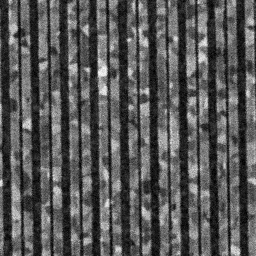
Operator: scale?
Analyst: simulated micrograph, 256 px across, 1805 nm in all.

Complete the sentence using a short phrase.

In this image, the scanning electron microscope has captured parallel lines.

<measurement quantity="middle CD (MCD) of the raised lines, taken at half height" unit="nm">55.5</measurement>